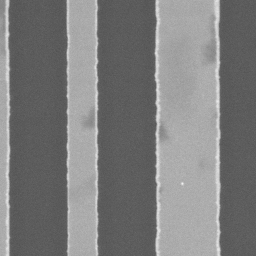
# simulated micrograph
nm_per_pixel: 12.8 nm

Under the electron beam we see lines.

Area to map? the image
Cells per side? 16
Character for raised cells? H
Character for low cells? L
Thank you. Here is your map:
HLLLHHLLLLHHHHLL
LLLLHHLLLLHHHHLL
HLLLHHLLLLHHHHLL
HLLLHHLLLLHHHHLL
HLLLHHLLLLHHHHLL
HLLLHHLLLLHHHHLL
HLLLHHLLLLHHHHLL
HLLLHHLLLLHHHHLL
HLLLHHLLLLHHHHLL
HLLLHHLLLLHHHHLL
HLLLHHLLLLHHHHLL
HLLLHHLLLLHHHHLL
HLLLHHLLLLHHHHLL
HLLLHHLLLLHHHHLL
HLLLHHLLLLHHHHLL
HLLLHHLLLLHHHHLL